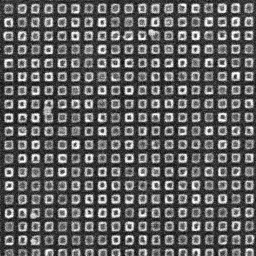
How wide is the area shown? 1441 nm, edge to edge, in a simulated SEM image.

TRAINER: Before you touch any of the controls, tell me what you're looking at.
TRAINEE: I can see a regular array of raised bodies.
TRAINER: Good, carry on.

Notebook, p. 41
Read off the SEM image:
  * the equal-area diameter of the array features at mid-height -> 50.8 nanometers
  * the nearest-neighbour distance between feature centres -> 73.2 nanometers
